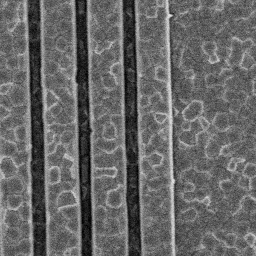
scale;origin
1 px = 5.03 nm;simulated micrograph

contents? parallel lines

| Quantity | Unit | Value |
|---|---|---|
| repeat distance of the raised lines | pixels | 47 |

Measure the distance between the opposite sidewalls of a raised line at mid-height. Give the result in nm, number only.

172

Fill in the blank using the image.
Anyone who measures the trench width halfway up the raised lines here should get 66.6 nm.